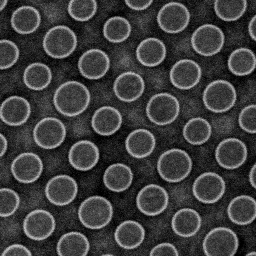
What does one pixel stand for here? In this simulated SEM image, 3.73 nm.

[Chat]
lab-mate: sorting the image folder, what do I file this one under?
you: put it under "a regular array of raised bodies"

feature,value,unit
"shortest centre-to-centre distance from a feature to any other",0.152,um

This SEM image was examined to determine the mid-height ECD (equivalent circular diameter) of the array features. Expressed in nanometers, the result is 109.